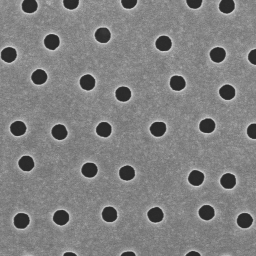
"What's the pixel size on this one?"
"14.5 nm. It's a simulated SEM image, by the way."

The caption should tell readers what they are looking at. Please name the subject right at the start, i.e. a regular array of holes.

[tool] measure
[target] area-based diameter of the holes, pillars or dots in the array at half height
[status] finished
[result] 230 nanometers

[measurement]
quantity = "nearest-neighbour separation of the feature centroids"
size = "561 nanometres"